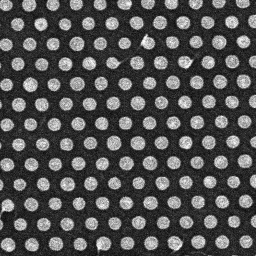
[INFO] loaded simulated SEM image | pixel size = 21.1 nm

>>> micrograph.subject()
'a regular array of raised bodies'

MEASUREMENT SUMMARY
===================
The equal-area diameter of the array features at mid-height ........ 267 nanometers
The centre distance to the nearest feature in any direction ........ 483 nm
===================